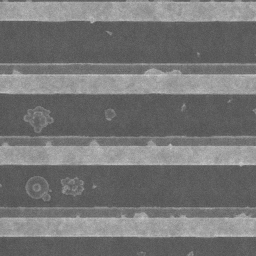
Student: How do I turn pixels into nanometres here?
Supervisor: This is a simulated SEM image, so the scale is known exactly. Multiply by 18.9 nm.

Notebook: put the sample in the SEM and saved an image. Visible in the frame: lines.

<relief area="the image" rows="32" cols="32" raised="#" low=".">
################################
################################
################################
................................
................................
................................
................................
................................
################################
################################
################################
################################
................................
................................
................................
................................
................................
################################
################################
################################
..#######.######################
................................
................................
................................
................................
................................
################################
################################
################################
################################
................................
................................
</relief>